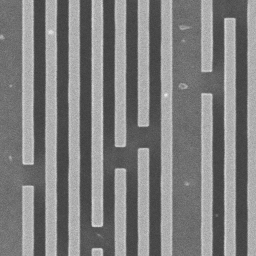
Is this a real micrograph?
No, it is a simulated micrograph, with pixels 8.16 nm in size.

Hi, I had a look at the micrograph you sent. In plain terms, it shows groups of lines, slits or small figures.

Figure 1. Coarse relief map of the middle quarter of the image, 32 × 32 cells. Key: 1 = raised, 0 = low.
01110001110001100001100011100000
01110001110001100001100011100000
01110001110001100001100011100000
01110001110001100001100011100000
01110001110001100001100011100000
01110001110001100001100011100000
01110001110001100001100011100000
01110001110001100001100011100000
01110001110001100001100011100000
01110001110001100001100011100000
01110001110001100001100011100000
01110001110001100001100011100000
01110001110001100001100011100000
01110001110001100001100011100000
01110001110001100001100011100000
01110001110001100001100011100000
01110001110001100000000011100000
01110001110001100000000011100000
01110001110001100000000011100000
01110001110001100000000011100000
01110001110000000000000011100000
01110001110000000001100011100000
01110001110000000001100011100000
01110001110000000001100011100000
01110001110000000001100011100000
01110001110000000001100011100000
01110001110001100001100011100000
01110001110001100001100011100000
01110001110001100001100011100000
01110001110001100001100011100000
01110001110001100001100011100000
01110001110001100001100011100000